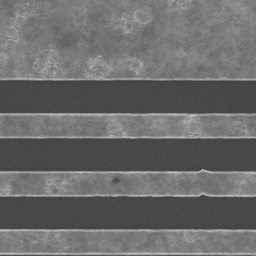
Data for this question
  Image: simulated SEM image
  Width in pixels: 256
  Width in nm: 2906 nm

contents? parallel lines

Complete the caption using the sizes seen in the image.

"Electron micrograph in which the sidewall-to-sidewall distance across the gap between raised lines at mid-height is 0.384 micrometres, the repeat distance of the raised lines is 660 nm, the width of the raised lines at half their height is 23.7 pixels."